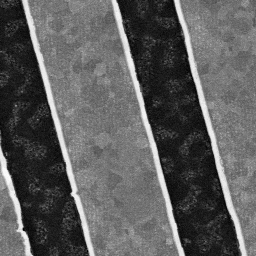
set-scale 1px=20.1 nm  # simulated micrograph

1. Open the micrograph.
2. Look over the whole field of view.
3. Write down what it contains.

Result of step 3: one or a few lines or trenches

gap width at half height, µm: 1.2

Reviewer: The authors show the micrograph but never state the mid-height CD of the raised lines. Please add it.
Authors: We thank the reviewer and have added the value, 1750 nm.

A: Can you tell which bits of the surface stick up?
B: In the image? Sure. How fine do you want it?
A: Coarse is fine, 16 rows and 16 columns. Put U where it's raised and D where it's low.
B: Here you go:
DDUUUUUDDDDUUUUU
DDUUUUUUDDDUUUUU
DDUUUUUUDDDDUUUU
DDUUUUUUDDDDUUUU
DDDUUUUUDDDDUUUU
DDDUUUUUUDDDUUUU
DDDUUUUUUDDDDUUU
DDDUUUUUUDDDDUUU
DDDDUUUUUDDDDUUU
DDDDUUUUUUDDDUUU
DDDDUUUUUUDDDDUU
UDDDDUUUUUDDDDUU
UDDDDUUUUUDDDDUU
UDDDDUUUUUUDDDDU
UDDDDUUUUUUDDDDU
UUDDDDUUUUUDDDDU